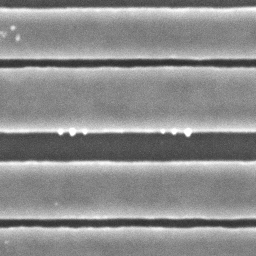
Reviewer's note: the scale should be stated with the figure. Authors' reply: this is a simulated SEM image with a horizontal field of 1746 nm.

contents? lines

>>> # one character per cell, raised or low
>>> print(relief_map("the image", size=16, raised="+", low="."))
................
++++++++++++++++
++++++++++++++++
++++++++++++++++
++++++++++++++++
++++++++++++++++
++++++++++++++++
++++++++++++++++
................
................
++++++++++++++++
++++++++++++++++
++++++++++++++++
++++++++++++++++
++++++++++++++++
++++++++++++++++